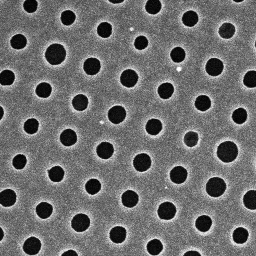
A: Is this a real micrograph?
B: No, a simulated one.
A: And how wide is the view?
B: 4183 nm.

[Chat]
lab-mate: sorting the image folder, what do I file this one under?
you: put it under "a regular array of holes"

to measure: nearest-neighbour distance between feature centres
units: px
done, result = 37.9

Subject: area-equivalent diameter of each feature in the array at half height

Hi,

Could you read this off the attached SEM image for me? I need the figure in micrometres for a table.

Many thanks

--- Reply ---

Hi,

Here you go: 0.276